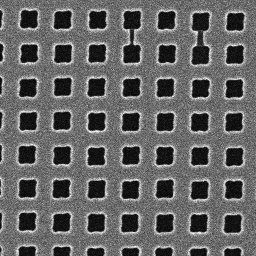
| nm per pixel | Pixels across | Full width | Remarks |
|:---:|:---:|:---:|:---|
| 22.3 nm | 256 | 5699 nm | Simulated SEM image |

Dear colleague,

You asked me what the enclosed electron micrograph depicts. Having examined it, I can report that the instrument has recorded a regular array of holes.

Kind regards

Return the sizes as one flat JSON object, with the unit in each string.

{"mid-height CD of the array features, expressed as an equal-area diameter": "440 nm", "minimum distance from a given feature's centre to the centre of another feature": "744 nm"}